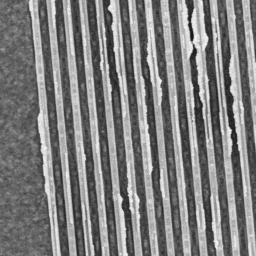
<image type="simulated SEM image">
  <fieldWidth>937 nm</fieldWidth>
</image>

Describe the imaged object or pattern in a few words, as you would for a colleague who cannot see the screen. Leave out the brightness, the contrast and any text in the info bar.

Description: parallel lines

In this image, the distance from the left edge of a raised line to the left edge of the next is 59.5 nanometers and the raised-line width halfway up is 0.0237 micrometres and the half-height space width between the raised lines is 0.0337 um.